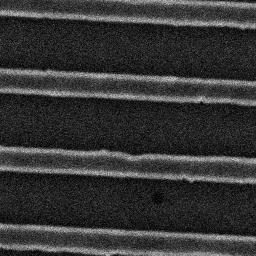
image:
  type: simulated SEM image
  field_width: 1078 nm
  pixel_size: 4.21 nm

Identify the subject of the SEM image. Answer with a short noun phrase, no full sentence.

one or a few lines or trenches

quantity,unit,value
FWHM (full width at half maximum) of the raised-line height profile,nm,88.2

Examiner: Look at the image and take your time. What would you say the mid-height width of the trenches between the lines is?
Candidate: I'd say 0.239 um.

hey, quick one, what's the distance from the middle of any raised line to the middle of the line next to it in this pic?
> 0.327 micrometres